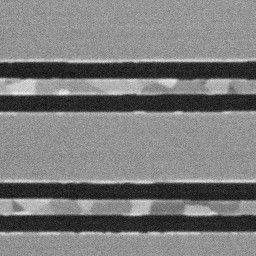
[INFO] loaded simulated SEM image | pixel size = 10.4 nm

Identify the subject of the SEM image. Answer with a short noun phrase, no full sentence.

lines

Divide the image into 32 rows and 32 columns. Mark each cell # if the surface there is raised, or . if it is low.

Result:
################################
################################
################################
################################
################################
################################
################################
################################
................................
................................
################################
################################
................................
................................
################################
################################
################################
################################
################################
################################
################################
################################
################################
................................
................................
################################
################################
................................
................................
################################
################################
################################